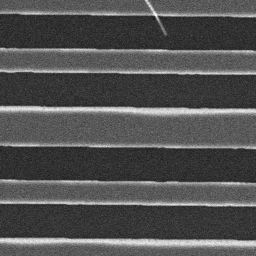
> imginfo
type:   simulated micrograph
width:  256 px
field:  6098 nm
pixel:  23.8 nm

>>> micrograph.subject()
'lines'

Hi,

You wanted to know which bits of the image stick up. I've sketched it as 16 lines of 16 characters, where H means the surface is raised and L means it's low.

HHHHHHHHHHHHHHHH
LLLLLLLLLLLLLLLL
LLLLLLLLLLLLLLLL
HHHHHHHHHHHHHHHH
LLHHHHHHHHHHHHHH
LLLLLLLLLLLLLLLL
LLLLLLLLLLLLLLLL
HHHHHHHHHHHHHHHH
HHHHHHHHHHHHHHHH
LLLLLLLLLLLLLLLL
LLLLLLLLLLLLLLLL
HHHHHHHHHHHHHHHH
HHHHHHHHHHHHHHHH
LLLLLLLLLLLLLLLL
LLLLLLLLLLLLLLLL
HHHHHHHHHHHHHHHH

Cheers